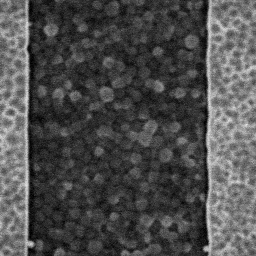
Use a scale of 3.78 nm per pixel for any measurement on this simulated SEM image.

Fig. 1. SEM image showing one or a few lines or trenches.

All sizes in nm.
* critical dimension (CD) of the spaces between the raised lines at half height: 687